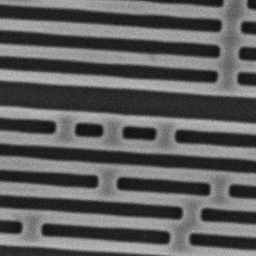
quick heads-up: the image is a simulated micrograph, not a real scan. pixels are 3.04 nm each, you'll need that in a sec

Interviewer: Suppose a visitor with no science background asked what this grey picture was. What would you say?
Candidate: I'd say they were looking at groups of lines, slits or small figures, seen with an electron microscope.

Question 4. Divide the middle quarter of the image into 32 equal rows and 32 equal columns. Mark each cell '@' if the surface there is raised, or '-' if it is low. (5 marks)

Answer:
-----------------------@@@@@@@@@
--------------------------------
--------------------------------
@@@@@@@@@@@@@@------------------
@@@@@@@@@@@@@@@@@@@@@@@@@@@@@@@@
-------@@@@@@@@@@@@@@@@@@@@@@@@@
---------------------@@@@@@@@@@@
--------------------------------
--------------------------------
--------------------------------
--------------------------------
--------------------------------
@@@@@@@@@@@@--------------------
@@@@@@@@@@@@@@@@@@@@@@@@@-------
@@@@@@@@@@@@@@@@@@@@@@@@@@@@@@@@
@@@-------@@@@@---@@@@@@@@@@@@@@
@@--------@@@@---------@@@@@----
@@@-------@@@@---------@@@@@----
@@@@@@@@@@@@@@@--------@@@@@----
@@@@@@@@@@@@@@@@@@@@@@@@@@@@----
@@@@@@@@@@@@@@@@@@@@@@@@@@@@@@@@
------------@@@@@@@@@@@@@@@@@@@@
----------------------------@@@@
--------------------------------
@@@@----------------------------
@@@@@@@@@@@@@@@@@@--------------
@@@@@@@@@@@@@@@@@@@@@@@@@@@@@@@@
-----@@@@@@@@@@@@@@@@@@@@@@@@@@@
--------@@@@@@------@@@@@@@@@@@@
---------@@@@-------------------
--------@@@@@-------------------
@@@@@@@@@@@@@@------------------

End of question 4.